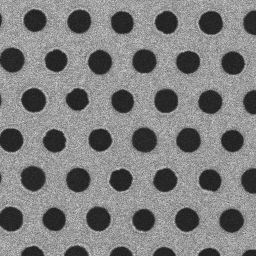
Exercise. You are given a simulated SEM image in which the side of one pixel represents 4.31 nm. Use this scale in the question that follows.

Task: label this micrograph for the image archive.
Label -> a regular array of holes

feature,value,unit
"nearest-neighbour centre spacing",189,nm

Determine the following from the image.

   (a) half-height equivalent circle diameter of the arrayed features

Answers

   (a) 99.5 nm